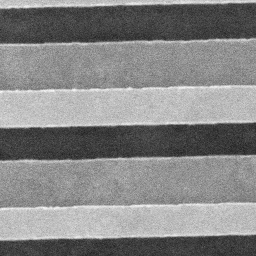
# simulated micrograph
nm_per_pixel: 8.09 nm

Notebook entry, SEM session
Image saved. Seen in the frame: lines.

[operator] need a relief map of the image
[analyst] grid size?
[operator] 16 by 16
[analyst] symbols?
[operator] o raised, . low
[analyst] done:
................
................
..............oo
oooooooooooooooo
oooooooooooooooo
oooooooooooooooo
oooooooooooooooo
oooooooooooooooo
................
................
oooooooooooooooo
oooooooooooooooo
oooooooooooooooo
oooooooooooooooo
oooooooooooooooo
................